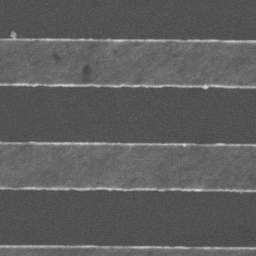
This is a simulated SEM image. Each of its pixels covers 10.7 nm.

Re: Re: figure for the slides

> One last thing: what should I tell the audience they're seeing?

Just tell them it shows lines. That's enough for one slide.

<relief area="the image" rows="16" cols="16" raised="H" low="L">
LLLLLLLLLLLLLLLL
LLLLLLLLLLLLLLLL
HHHHHHHLLLLLLLLL
HHHHHHHHHHHHHHHH
HHHHHHHHHHHHHHHH
LLLLLLLLLLLLLLLL
LLLLLLLLLLLLLLLL
LLLLLLLLLLLLLLLL
LLLLLLLLLLLLLLLL
HHHHHHHHHHHHHHHH
HHHHHHHHHHHHHHHH
HHHHHHHHHHHHHHHH
LLLLLLLLLLLLLLLL
LLLLLLLLLLLLLLLL
LLLLLLLLLLLLLLLL
HHHHHHHHHHHHHHHH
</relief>